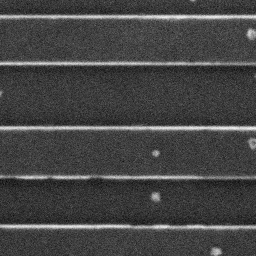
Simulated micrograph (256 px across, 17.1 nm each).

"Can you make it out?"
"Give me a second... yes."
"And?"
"lines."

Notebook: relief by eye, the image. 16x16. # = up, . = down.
................
################
################
################
................
................
................
................
################
################
################
................
................
................
################
################